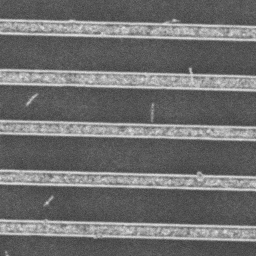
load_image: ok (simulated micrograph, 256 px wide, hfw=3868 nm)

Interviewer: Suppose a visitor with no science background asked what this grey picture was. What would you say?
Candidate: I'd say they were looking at parallel lines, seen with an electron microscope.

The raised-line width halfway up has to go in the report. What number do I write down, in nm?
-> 198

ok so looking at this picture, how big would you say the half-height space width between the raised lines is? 37.1 pixels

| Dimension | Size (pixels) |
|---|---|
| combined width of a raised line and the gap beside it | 50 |